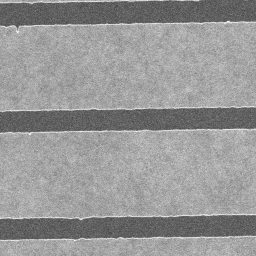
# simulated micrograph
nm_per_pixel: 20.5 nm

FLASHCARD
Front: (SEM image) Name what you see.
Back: one or a few lines or trenches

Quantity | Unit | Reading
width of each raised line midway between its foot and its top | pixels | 22.6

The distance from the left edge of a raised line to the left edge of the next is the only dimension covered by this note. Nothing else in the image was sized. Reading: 2200 nanometres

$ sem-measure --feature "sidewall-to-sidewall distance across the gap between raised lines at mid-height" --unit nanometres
1740